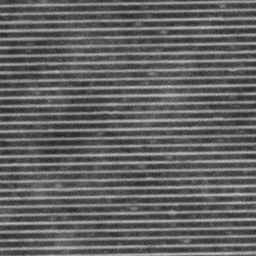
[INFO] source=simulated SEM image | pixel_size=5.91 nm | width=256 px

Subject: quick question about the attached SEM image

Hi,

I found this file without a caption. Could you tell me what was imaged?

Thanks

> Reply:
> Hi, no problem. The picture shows parallel lines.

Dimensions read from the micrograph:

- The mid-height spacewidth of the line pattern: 37.7 nanometres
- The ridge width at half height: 11.1 nm